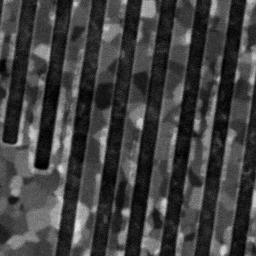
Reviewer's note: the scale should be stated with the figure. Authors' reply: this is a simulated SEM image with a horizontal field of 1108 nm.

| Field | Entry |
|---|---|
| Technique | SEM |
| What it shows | parallel lines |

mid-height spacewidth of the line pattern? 68.6 nm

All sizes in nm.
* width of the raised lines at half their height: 80.3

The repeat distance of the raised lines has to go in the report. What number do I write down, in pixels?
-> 34.4